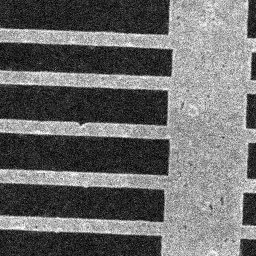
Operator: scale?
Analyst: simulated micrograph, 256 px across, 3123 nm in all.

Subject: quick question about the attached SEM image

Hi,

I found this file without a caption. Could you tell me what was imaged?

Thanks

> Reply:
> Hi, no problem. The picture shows parallel lines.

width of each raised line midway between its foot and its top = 149 nm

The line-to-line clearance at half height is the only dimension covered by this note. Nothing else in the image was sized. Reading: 413 nm